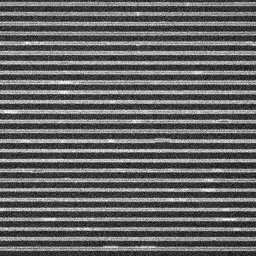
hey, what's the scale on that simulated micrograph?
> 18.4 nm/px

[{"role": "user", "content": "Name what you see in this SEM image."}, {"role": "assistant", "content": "parallel lines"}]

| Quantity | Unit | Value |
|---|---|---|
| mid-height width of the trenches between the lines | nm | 129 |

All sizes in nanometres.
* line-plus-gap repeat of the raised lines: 180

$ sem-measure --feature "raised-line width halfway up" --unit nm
50.5